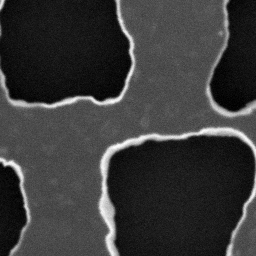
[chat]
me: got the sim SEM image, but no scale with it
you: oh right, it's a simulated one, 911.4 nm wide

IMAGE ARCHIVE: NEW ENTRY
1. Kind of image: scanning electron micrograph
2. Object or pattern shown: holes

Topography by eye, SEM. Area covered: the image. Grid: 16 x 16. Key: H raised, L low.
LLLLLLLHHHHHHHLL
LLLLLLLLHHHHHHLL
LLLLLLLLHHHHHHLL
LLLLLLLLHHHHHHLL
LLLLLLLLHHHHHLLL
LLLLLLLLHHHHHLLL
HHHHHHHHHHHHHHLL
HHHHHHHHHHHHHHHH
HHHHHHHHHHHHLLLH
HHHHHHHLLLLLLLLL
LHHHHHHLLLLLLLLL
LHHHHHHLLLLLLLLL
LLHHHHHLLLLLLLLH
LLHHHHHLLLLLLLLH
LHHHHHHLLLLLLLLH
LHHHHHHLLLLLLLHH